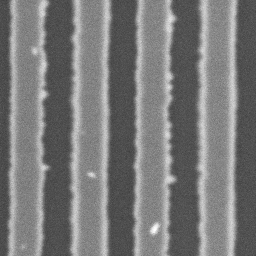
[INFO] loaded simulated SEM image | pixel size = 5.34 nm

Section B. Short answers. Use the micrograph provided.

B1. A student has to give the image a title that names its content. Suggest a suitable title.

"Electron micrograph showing lines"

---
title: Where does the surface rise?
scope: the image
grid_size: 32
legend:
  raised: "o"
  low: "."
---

.ooooo....oooo...oooo....oooo...
.ooooo....oooo...oooo....oooo...
.oooo....ooooo...ooooo...oooo...
.oooo.....ooo....ooooo...oooo...
.oooo....oooo....oooo....oooo...
.oooo....ooooo...oooo....oooo...
.ooooo...oooo....oooo....oooo...
.ooooo...oooo....oooo....oooo...
.ooooo...oooo....oooo....oooo...
.oooo....oooo....oooo....oooo...
.ooooo....ooo....oooo....oooo...
.ooooo...oooo....oooo....oooo...
.oooo....oooo....oooo....oooo...
.oooo....oooo....oooo....oooo...
.oooo.....ooo....oooo....oooo...
.oooo....oooo....oooo....oooo...
.oooo....oooo....oooo....oooo...
.oooo....oooo....oooo....oooo...
.oooo....oooo....oooo....oooo...
.oooo....oooo....oooo....oooo...
.ooooo...oooo....oooo....oooo...
.ooooo...oooo....oooo....oooo...
.oooo....oooo....ooooo...oooo...
.oooo....oooo....oooo....oooo...
.oooo....oooo....oooo....oooo...
.oooo....oooo....oooo....oooo...
.oooo....oooo....oooo....oooo...
.oooo....oooo....oooo....oooo...
.oooo....oooo....oooo....oooo...
.oooo....oooo....oooo....oooo...
.oooo....oooo....oooo....oooo...
.oooo....oooo....oooo....oooo...